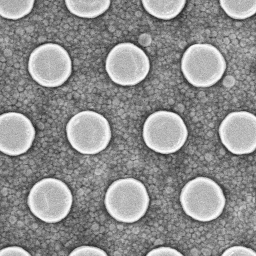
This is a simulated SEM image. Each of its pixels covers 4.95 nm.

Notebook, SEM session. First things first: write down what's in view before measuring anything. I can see a regular array of raised bodies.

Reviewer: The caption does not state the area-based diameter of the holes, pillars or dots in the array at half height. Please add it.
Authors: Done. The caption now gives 0.211 microns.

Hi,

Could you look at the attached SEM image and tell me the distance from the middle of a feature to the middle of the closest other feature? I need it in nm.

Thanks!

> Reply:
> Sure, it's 376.